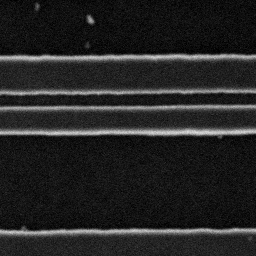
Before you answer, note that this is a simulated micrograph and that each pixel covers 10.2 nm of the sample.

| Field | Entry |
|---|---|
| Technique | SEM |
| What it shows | lines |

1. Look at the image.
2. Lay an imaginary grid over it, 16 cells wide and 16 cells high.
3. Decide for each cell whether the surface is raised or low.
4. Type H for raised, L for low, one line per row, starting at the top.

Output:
LLLLLLLLLLLLLLLL
LLLLLLLLLLLLLLLL
LLLLLLLLLLLLLLLL
LLLLLLLLLLLLLLLL
HHHHHHHHHHHHHHHH
HHHHHHHHHHHHHHHH
HHHHHHHHHHHHHHHH
HHHHHHHHHHHHHHHH
LLLLLLLLLLLLLLLL
LLLLLLLLLLLLLLLL
LLLLLLLLLLLLLLLL
LLLLLLLLLLLLLLLL
LLLLLLLLLLLLLLLL
LLLLLLLLLLLLLLLL
HHHHHHHHHHHHHHHH
HHHHHHHHHHHHHHHH